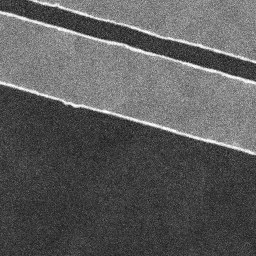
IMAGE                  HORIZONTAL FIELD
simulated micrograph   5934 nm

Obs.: one or a few lines or trenches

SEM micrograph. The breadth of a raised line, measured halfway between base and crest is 1600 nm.